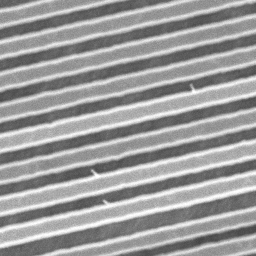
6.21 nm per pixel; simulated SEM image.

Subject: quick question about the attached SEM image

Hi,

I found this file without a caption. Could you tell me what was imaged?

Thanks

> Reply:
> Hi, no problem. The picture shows parallel lines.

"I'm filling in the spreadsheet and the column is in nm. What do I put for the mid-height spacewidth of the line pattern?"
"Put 87.9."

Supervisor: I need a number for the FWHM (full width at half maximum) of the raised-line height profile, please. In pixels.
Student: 17.1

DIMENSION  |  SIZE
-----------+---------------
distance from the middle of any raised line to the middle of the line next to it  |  192 nm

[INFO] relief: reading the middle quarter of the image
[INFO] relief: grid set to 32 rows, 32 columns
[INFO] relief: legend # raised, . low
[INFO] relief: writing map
##########................######
#####..................#########
##...............###############
.............###################
.........##################.....
.....#################..........
##################..............
###############..............###
##########...............#######
####..................##########
#................###############
............###################.
........##################......
...###################..........
#################...............
#############.................##
#########................#######
####.................###########
................################
............##################..
.......##################.......
...##################...........
################................
##############...............###
########................########
###.................############
...............#################
...........##################...
......###################.......
..##################............
###############.................
############................####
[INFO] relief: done